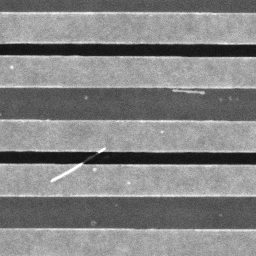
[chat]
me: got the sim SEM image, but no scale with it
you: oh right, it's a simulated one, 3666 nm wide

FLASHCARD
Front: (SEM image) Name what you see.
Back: lines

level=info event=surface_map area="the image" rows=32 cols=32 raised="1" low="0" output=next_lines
00000000000000000000000000000000
00000000000000000000000000000000
11111111111111111111111111111111
11111111111111111111111111111111
11111111111111111111111111111111
00000000000000000000000000000000
00000000000000000000000000000000
11111111111111111111111111111111
11111111111111111111111111111111
11111111111111111111111111111111
11111111111111111111111111111111
00000000000000000000000000000000
00000000000000000000000000000000
00000000000000000000000000000000
00000000000000000000000000000000
11111111111111111111111111111111
11111111111111111111111111111111
11111111111111111111111111111111
11111111111111111111111111111111
00000000000000000000000000000000
00000000001000000000000000000000
11111111111111111111111111111111
11111111111111111111111111111111
11111111111111111111111111111111
11111111111111111111111111111111
00000000000000000000000000000000
00000000000000000000000000000000
00000000000000000000000000000000
00000000000000000000000000000000
11111111111111111111111111111111
11111111111111111111111111111111
11111111111111111111111111111111